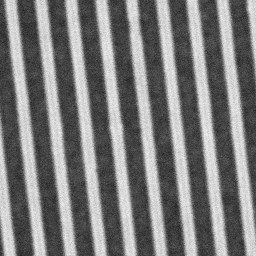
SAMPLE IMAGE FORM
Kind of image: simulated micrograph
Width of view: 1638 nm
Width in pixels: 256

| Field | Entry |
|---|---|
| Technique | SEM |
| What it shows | parallel lines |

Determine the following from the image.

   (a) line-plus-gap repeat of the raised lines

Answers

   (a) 192 nm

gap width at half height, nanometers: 143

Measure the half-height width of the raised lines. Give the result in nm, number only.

49.2